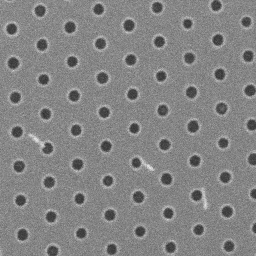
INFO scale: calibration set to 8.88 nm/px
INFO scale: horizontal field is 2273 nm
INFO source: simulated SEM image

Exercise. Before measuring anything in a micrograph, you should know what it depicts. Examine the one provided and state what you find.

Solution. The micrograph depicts a regular array of holes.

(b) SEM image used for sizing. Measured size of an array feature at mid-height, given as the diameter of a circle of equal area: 0.105 um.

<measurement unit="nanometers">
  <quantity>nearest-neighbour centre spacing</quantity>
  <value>298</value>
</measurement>